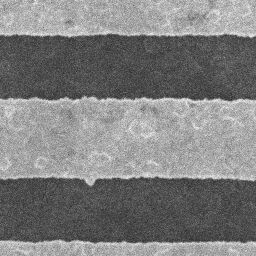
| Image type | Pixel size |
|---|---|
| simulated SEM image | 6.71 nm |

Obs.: one or a few lines or trenches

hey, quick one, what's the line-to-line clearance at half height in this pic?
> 64.4 px